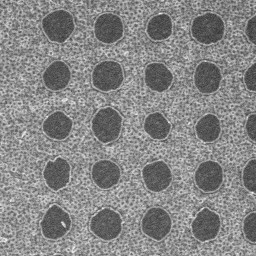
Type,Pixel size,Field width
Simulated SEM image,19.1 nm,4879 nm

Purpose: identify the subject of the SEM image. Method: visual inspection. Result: a regular array of raised bodies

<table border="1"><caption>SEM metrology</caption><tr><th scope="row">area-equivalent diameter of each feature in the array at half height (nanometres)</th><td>607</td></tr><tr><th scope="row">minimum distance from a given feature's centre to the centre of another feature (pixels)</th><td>48.4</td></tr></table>